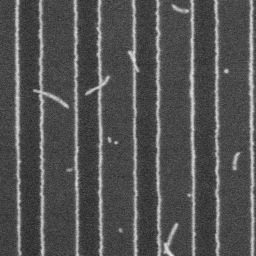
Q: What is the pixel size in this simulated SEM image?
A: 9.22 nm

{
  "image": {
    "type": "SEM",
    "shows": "lines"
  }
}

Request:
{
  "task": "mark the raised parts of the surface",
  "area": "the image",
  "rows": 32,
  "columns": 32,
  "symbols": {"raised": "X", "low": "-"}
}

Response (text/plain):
XX---XXXX---XXXXX---XXXX---XXXX-
XX---XXXX---XXXXX---XXXX---XXXX-
XX---XXXX---XXXXX---XXXX---XXXX-
XX---XXXX---XXXXX---XXXX---XXXX-
XX---XXXX---XXXXX---XXXX---XXXX-
XX---XXXX---XXXXX---XXXX---XXXX-
XX---XXXX---XXXXX---XXXX---XXXX-
XX---XXXX---XXXXX---XXXX---XXXX-
XX---XXXX---XXXXX---XXXX---XXXX-
XX---XXXXX--XXXXX---XXXX---XXXX-
XX---XXXXX--XXXXX---XXXX---XXXX-
XX---XXXXX--XXXXX---XXXX---XXXX-
XX---XXXXX--XXXXX---XXXX---XXXX-
XX---XXXXX--XXXXX---XXXX---XXXX-
XX---XXXXX--XXXXX---XXXX---XXXX-
XX---XXXXX--XXXXX---XXXX---XXXX-
XX---XXXXX--XXXXX---XXXX---XXXX-
XX---XXXXX--XXXXX---XXXX---XXXX-
XX---XXXXX--XXXXX---XXXX---XXXX-
XX---XXXXX--XXXXX---XXXX---XXXX-
XX---XXXXX--XXXXX---XXXX---XXXX-
XX---XXXXX--XXXXX---XXXX---XXXXX
XX---XXXXX--XXXXX---XXXX---XXXXX
XX---XXXXX--XXXXX---XXXX---XXXXX
XX---XXXXX--XXXXX---XXXX---XXXX-
XX---XXXXX--XXXXX---XXXX---XXXX-
XX---XXXXX--XXXXX---XXXX---XXXXX
XX---XXXXX--XXXXX---XXXX---XXXXX
XX---XXXXX---XXXX---XXXX---XXXXX
XX---XXXXX---XXXX---XXXX---XXXXX
XX---XXXXX---XXXX---XXXX---XXXX-
XX---XXXXX--XXXXX---XXXX---XXXX-